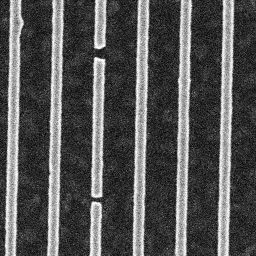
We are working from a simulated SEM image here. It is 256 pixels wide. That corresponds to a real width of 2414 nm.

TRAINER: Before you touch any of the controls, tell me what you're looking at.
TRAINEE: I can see parallel lines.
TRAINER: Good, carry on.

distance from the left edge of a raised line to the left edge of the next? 401 nanometers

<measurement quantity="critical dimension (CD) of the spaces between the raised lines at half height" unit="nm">305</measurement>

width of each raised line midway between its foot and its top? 95.4 nm